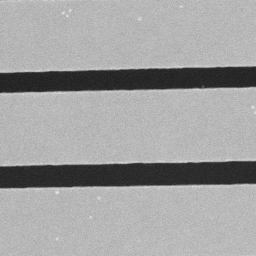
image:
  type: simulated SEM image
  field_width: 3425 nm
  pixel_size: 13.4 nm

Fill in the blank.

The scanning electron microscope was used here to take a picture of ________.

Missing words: lines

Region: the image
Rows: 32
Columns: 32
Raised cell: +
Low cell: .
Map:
++++++++++++++++++++++++++++++++
++++++++++++++++++++++++++++++++
++++++++++++++++++++++++++++++++
++++++++++++++++++++++++++++++++
++++++++++++++++++++++++++++++++
++++++++++++++++++++++++++++++++
++++++++++++++++++++++++++++++++
++++++++++++++++++++++++++++++++
+++++++++++++++++++.............
................................
................................
......++++++++++++++++++++++++++
++++++++++++++++++++++++++++++++
++++++++++++++++++++++++++++++++
++++++++++++++++++++++++++++++++
++++++++++++++++++++++++++++++++
++++++++++++++++++++++++++++++++
++++++++++++++++++++++++++++++++
++++++++++++++++++++++++++++++++
++++++++++++++++++++++++++++++++
++++++++++++++..................
................................
................................
...+++++++++++++++++++++++++++++
++++++++++++++++++++++++++++++++
++++++++++++++++++++++++++++++++
++++++++++++++++++++++++++++++++
++++++++++++++++++++++++++++++++
++++++++++++++++++++++++++++++++
++++++++++++++++++++++++++++++++
++++++++++++++++++++++++++++++++
++++++++++++++++++++++++++++++++